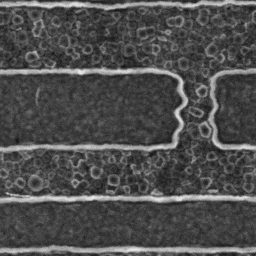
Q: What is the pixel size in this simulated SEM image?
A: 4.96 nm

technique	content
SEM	one or a few lines or trenches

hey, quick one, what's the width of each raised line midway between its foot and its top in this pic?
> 328 nm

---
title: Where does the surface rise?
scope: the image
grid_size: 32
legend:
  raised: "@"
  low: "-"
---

--@@@--@-@-------@@@@@@--@@@@@@@
@@@@@@@@@@@@@@@@@@@@@@@@@@@@@@@@
@@@@@@@@@@@@@@@@@@@@@@@@@@@@@@@@
@@@@@@@@@@@@@@@@@@@@@@@@@@@@@@@@
@@@@@@@@@@@@@@@@@@@@@@@@@@@@@@@@
@@@@@@@@@@@@@@@@@@@@@@@@@@@@@@@@
@@@@@@@@@@@@@@@@@@@@@@@@@@@@@@@@
@@@@@@@@@@@@@@@@@@@@@@@@@@@@@@@@
@@@@@@@@@@@@@@@@@@@@@@@@@@@@@@@@
----------------------@@@@@-----
-----------------------@@@@-----
-----------------------@@@@-----
-----------------------@@@@-----
----------------------@@@@@-----
----------------------@@@@------
-----------------------@@@@-----
----------------------@@@@@-----
----------------------@@@@@-----
---@@@@@@@@@@@@@---@@@@@@@@@@@@@
@@@@@@@@@@@@@@@@@@@@@@@@@@@@@@@@
@@@@@@@@@@@@@@@@@@@@@@@@@@@@@@@@
@@@@@@@@@@@@@@@@@@@@@@@@@@@@@@@@
@@@@@@@@@@@@@@@@@@@@@@@@@@@@@@@@
@@@@@@@@@@@@@@@@@@@@@@@@@@@@@@@@
@@@@@@@@@@@@@@@@@@@@@@@@@@@@@@@@
--------------------------------
--------------------------------
--------------------------------
--------------------------------
--------------------------------
--------------------------------
@@@@@@@@@@@@@@@@@@@@@@@@@@@@@@@@